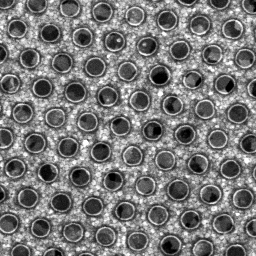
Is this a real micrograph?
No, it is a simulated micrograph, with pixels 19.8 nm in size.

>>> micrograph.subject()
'a regular array of raised bodies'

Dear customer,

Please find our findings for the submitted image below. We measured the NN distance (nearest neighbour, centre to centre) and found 631 nm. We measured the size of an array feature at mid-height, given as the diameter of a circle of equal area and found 0.365 microns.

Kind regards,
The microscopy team